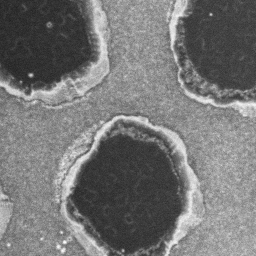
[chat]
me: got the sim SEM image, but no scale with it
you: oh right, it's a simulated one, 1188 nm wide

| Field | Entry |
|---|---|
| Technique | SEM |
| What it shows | raised bodies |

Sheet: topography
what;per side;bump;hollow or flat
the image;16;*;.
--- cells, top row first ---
******.....*****
******.....*****
******.....*****
******.....*****
******.....*****
****.......*****
.............***
.......**.......
......*****.....
.....******.....
.....*******....
....********....
....********....
....********....
.....******.....
......*****.....